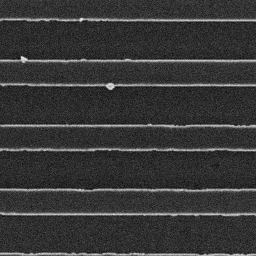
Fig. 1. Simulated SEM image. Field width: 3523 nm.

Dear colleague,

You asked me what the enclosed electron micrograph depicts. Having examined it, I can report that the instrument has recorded lines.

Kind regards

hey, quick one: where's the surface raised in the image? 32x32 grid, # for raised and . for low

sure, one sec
################################
################################
#..########.####################
................................
................................
................................
................................
..##......#....##...............
################################
################################
################################
................................
................................
................................
................................
................................
################################
################################
################################
................................
................................
................................
................................
................................
################################
################################
################################
................................
................................
................................
................................
................................